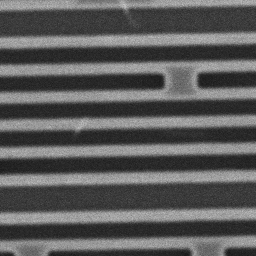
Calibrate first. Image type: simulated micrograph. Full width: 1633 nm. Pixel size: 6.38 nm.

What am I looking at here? groups of lines, slits or small figures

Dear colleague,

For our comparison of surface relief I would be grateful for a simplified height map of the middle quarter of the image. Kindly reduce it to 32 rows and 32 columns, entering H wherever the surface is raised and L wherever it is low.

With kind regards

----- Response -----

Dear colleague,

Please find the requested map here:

HHHHHHHHHHHHHHHHHHHHHHHHHHHHHHHH
HHHHHHHHHHHHHHHHHHHHHHHHHHHHHHHH
LLLLLLLLLLLLLLLLLLLLLLLLLHHHHHHH
LLLLLLLLLLLLLLLLLLLLLLLLLHHHHHHH
LLLLLLLLLLLLLLLLLLLLLLLLLHHHHHHH
LLLLLLLLLLLLLLLLLLLLLLLLLHHHHHHH
LLLLLLLLLLLLLLLLLLLLLLLLLHHHHHHH
HHHHHHHHHHHHHHHHHHHHHHHHHHHHHHHH
HHHHHHHHHHHHHHHHHHHHHHHHHHHHHHHH
LLLLLLLLLLLLLLLLLLLLLLLLLLLLLLLL
LLLLLLLLLLLLLLLLLLLLLLLLLLLLLLLL
LLLLLLLLLLLLLLLLLLLLLLLLLLLLLLLL
LLLLLLLLLLLLLLLLLLLLLLLLLLLLLLLL
LLLLLLLLLLLLLLLLLLLLLLHHHHHHHHHH
HHHHHHHHHHHHHHHHHHHHHHHHHHHHHHHH
HHHHHHHHHHHHHHHHHHHHHHHHHHHHHHHH
LLLHLLLLLLLLLLLLLLLLLLLLLLLLLLLL
LLLLLLLLLLLLLLLLLLLLLLLLLLLLLLLL
LLLLLLLLLLLLLLLLLLLLLLLLLLLLLLLL
LLLLLLLLLLLLLLLLLLLLLLLLLLLLLLLL
LLLLLLLLLHHHHHHHHHHHHHHHHHHHHHHH
HHHHHHHHHHHHHHHHHHHHHHHHHHHHHHHH
HHHHHHHHHHHHHHHHHHHHHHHHHHHHHHHH
LLLLLLLLLLLLLLLLLLLLLLLLLLLLLLLL
LLLLLLLLLLLLLLLLLLLLLLLLLLLLLLLL
LLLLLLLLLLLLLLLLLLLLLLLLLLLLLLLL
LLLLLLLLLLLLLLLLLLLLLLLLLLLLLLLL
LLLLLLLLLHHHHHHHHHHHHHHHHHHHHHHH
HHHHHHHHHHHHHHHHHHHHHHHHHHHHHHHH
HHHHHHHHHHHHHHHHHHHHHHHHLLLLLLLL
LLLLLLLLLLLLLLLLLLLLLLLLLLLLLLLL
LLLLLLLLLLLLLLLLLLLLLLLLLLLLLLLL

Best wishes